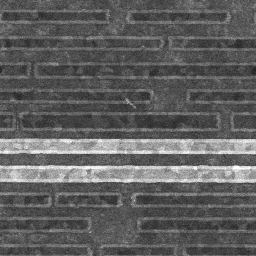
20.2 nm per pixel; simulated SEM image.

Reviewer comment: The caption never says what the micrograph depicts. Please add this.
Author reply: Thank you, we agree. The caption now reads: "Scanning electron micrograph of parallel lines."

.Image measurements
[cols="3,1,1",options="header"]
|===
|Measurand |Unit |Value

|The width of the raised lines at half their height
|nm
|237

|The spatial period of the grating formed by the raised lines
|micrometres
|0.525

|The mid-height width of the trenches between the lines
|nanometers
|292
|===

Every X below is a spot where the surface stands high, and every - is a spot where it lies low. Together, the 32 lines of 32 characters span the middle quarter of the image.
XXXXXXXXXXXXXXXXXXXXXXXXXXXXXXXX
XXXXXXXXXXXXXXXXXXXXXXXXXXXXXXXX
XXXXXXXXXXXXXXXXXXXXXXXXXXXXXXXX
--------------------------------
--------------------------------
--------------------------------
--------------------------------
XXXXXXXXXXXXXXXXXXXXXX---------X
XXXXXXXXXXXXXXXXXXXXXX---------X
----------------X---------------
--------------------------------
--------------------------------
---------------X----X-------X---
XXXXXXXXXXXXXXXXXXXXXXXXXXXXXXXX
XXXXXXXXXXXXXXXXXXXXXXXXXXXXXXXX
XXXXXXXXXXXXXXXXXXXXXXXXXXXXXXXX
--------------------------------
--------------------------------
--------------------------------
XXXXXXXXXXXXXXXXXXXXXXXXXXXXXXXX
XXXXXXXXXXXXXXXXXXXXXXXXXXXXXXXX
XXXXXXXXXXXXXXXXXXXXXXXXXXXXXXXX
--------------------------------
--------------------------------
--------------------------------
--------------------------------
XXXXXXXXXXXXXXXXXXXXXXXXXXXXXXXX
XXXXXXXXXXXXXXXXXXXXXXXXXXXXXXXX
XXXXXXXXXXXXXXXXXXXXXXXXXXXXXXXX
--------------------------------
--------------------------------
--------------------------------